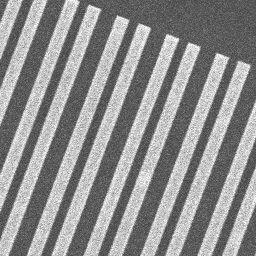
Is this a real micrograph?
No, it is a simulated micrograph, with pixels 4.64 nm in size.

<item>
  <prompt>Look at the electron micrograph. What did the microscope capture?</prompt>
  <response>parallel lines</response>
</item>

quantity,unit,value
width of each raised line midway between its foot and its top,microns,0.058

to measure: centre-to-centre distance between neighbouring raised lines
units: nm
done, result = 123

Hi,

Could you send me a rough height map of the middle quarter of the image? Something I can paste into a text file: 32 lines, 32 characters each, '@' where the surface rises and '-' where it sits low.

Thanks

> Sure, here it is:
@@@@-----@@@---@@@-----@@@---@@@
@@@-----@@@@--@@@@----@@@@---@@@
@@@-----@@@---@@@-----@@@---@@@-
@@@-----@@@---@@@-----@@@---@@@-
@@-----@@@---@@@@----@@@@--@@@@-
@@-----@@@---@@@-----@@@---@@@--
@-----@@@@---@@@----@@@@---@@@--
@-----@@@---@@@-----@@@---@@@@--
@-----@@@---@@@-----@@@---@@@---
-----@@@@--@@@@----@@@@--@@@@---
-----@@@---@@@-----@@@---@@@----
-----@@@---@@@-----@@@---@@@----
----@@@---@@@@----@@@@--@@@@----
----@@@---@@@-----@@@---@@@-----
---@@@@---@@@----@@@@---@@@-----
---@@@---@@@-----@@@---@@@@----@
---@@@---@@@-----@@@---@@@-----@
--@@@@--@@@@----@@@@--@@@@-----@
--@@@---@@@-----@@@---@@@-----@@
--@@@---@@@-----@@@---@@@-----@@
-@@@---@@@@----@@@@--@@@@-----@@
-@@@---@@@-----@@@---@@@-----@@@
@@@@---@@@----@@@@---@@@-----@@@
@@@---@@@-----@@@---@@@@----@@@@
@@@---@@@-----@@@---@@@-----@@@-
@@@--@@@@----@@@@--@@@@-----@@@-
@@---@@@-----@@@---@@@-----@@@@-
@@---@@@-----@@@---@@@-----@@@--
@---@@@@----@@@@--@@@@-----@@@--
@---@@@-----@@@---@@@-----@@@---
@---@@@----@@@@---@@@-----@@@---
---@@@-----@@@---@@@@----@@@@---